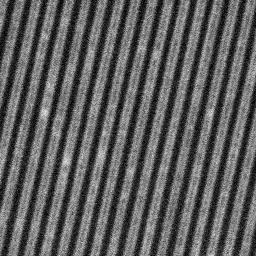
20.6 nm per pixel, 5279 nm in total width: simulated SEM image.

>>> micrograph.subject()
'parallel lines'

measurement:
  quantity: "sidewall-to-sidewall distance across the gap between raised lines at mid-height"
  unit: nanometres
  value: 216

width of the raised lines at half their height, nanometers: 126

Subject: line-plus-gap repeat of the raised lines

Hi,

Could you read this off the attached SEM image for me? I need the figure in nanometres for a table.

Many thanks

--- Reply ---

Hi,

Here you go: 333